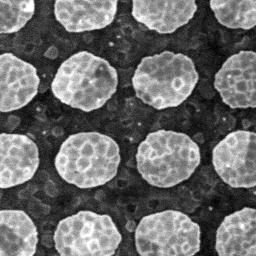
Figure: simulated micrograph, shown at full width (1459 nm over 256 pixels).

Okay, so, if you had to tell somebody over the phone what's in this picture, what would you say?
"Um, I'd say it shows raised bodies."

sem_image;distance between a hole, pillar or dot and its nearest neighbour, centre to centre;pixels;78.2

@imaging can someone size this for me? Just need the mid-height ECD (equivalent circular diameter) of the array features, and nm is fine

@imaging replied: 331